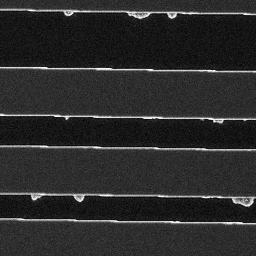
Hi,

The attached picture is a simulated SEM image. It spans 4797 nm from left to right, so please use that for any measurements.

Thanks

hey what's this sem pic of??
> lines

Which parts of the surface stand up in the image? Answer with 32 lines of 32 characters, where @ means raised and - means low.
@@@@@@@@@@@@@@@@@@@@@@@@@@@@@@@@
---------------@@@@@@@@@@@@@@@@@
--------------------------------
--------------------------------
--------------------------------
--------------------------------
--------------------------------
--------------------------------
@@@@@@--------------------------
@@@@@@@@@@@@@@@@@@@@@@@@@@@@@@@@
@@@@@@@@@@@@@@@@@@@@@@@@@@@@@@@@
@@@@@@@@@@@@@@@@@@@@@@@@@@@@@@@@
@@@@@@@@@@@@@@@@@@@@@@@@@@@@@@@@
@@@@@@@@@@@@@@@@@@@@@@@@@@@@@@@@
------@@@@@@@@@@@@@@@@@@@@@@@@@@
--------------------------------
--------------------------------
--------------------------------
@@@@@@@@@@@@@-------------------
@@@@@@@@@@@@@@@@@@@@@@@@@@@@@@@@
@@@@@@@@@@@@@@@@@@@@@@@@@@@@@@@@
@@@@@@@@@@@@@@@@@@@@@@@@@@@@@@@@
@@@@@@@@@@@@@@@@@@@@@@@@@@@@@@@@
@@@@@@@@@@@@@@@@@@@@@@@@@@@@@@@@
---------@@--------@@@@@@@@@@@@@
------------------------------@-
--------------------------------
@@@-----------------------------
@@@@@@@@@@@@@@@@@@@@@@@@@@@@@@@@
@@@@@@@@@@@@@@@@@@@@@@@@@@@@@@@@
@@@@@@@@@@@@@@@@@@@@@@@@@@@@@@@@
@@@@@@@@@@@@@@@@@@@@@@@@@@@@@@@@